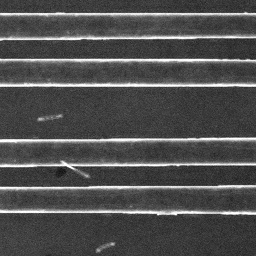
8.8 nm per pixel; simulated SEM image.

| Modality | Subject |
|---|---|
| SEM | lines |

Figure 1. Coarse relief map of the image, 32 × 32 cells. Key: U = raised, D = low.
DDDDDDDDDDDDDDDDDDDDDDDDDDDDDDDD
DDDDDDDDDDDDDDDDDDDDDDDDDDDDDDDD
UUUUUUUUUUUUUUUUUUUUUUUUUUUUUUUU
UUUUUUUUUUUUUUUUUUUUUUUUUUUUUUUU
UUUUUUUUUUUUUUUUUUUUUUUUUUUUUUUU
DDDDDDDDDDDDDDDDDDDDDDDDDDDDDDDD
DDDDDDDDDDDDDDDDDDDDDDDDDDDDDDDD
UUUUUUUUUUDDUUUUUUUUUDDDDDDDDDDD
UUUUUUUUUUUUUUUUUUUUUUUUUUUUUUUU
UUUUUUUUUUUUUUUUUUUUUUUUUUUUUUUU
UUUUUUUUUUUUUUUUUUUUUUUUUUUUUUUU
DDDDDDDDDDDDDDDDDDDDDDDDDDDDDDDD
DDDDDDDDDDDDDDDDDDDDDDDDDDDDDDDD
DDDDDDDDDDDDDDDDDDDDDDDDDDDDDDDD
DDDDDDDDDDDDDDDDDDDDDDDDDDDDDDDD
DDDDDDDDDDDDDDDDDDDDDDDDDDDDDDDD
DDDDDDDDDDDDDDDDDDDDDDDDDDDDDDDD
DDDDDDDDDDDDDDDDUUUUUUUUUUUUUUUU
UUUUUUUUUUUUUUUUUUUUUUUUUUUUUUUU
UUUUUUUUUUUUUUUUUUUUUUUUUUUUUUUU
UUUUUUUUUUUUUUUUUUUUUUUUUUUUUUUU
DDDDDDDDDDDDDDDDDDDDDDDDDDDDDDDD
DDDDDDDDDDDDDDDDDDDDDDDDDDDDDDDD
UUUUUUUUUUUUUUUUUUUUUUUUUUUUUUUU
UUUUUUUUUUUUUUUUUUUUUUUUUUUUUUUU
UUUUUUUUUUUUUUUUUUUUUUUUUUUUUUUU
UUUUUUUUUUUUUUUUUUUUUUUUUUUUUUUU
DDDDDDDDDDDDDDDDDDDDDDDDDDDDDDDD
DDDDDDDDDDDDDDDDDDDDDDDDDDDDDDDD
DDDDDDDDDDDDDDDDDDDDDDDDDDDDDDDD
DDDDDDDDDDDDDDDDDDDDDDDDDDDDDDDD
DDDDDDDDDDDDDDDDDDDDDDDDDDDDDDDD